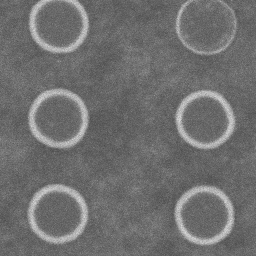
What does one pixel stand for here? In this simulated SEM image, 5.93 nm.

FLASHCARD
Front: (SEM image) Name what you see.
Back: raised bodies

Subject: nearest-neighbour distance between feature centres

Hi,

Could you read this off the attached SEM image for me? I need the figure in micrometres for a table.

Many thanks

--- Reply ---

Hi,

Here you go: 0.567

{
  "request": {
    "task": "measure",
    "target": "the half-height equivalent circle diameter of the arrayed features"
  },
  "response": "323 nanometers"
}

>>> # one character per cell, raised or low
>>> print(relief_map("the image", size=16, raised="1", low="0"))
0011100000000000
0011100000000000
0011100000000000
0000000000000000
0000000000000000
0000000000000000
0011100000011100
0011100000011100
0011100000001100
0000000000000000
0000000000000000
0000000000000000
0011100000011100
0011100000011100
0011100000001100
0000000000000000